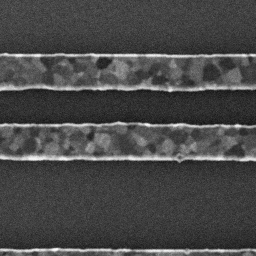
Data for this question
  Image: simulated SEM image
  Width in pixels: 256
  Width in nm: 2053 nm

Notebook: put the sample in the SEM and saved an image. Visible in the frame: lines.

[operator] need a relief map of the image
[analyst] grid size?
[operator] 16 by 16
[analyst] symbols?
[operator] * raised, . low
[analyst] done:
................
................
................
****************
****************
**.*************
................
................
****************
****************
................
................
................
................
................
................